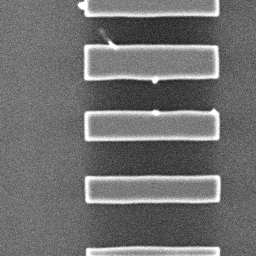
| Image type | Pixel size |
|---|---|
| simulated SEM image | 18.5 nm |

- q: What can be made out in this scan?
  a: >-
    groups of lines, slits or small figures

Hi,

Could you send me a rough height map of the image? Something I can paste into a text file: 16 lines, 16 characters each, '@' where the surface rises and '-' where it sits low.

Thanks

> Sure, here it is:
-----@@@@@@@@@--
----------------
----------------
-----@@@@@@@@@--
-----@@@@@@@@@--
----------------
----------------
-----@@@@@@@@@--
-----@@@@@@@@@--
----------------
----------------
-----@@@@@@@@@--
------@@@@@@@---
----------------
----------------
-------@@@@@@---